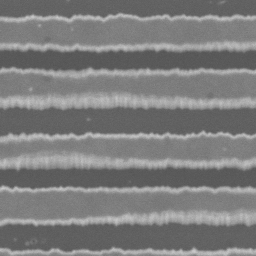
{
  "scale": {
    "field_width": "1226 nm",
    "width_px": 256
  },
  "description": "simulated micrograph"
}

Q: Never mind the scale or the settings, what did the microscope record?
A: lines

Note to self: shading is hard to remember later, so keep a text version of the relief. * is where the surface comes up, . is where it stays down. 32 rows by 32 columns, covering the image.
................................
................................
********************************
********************************
********************************
********************************
................................
................................
.*..............................
********************************
********************************
********************************
********************************
................................
................................
................................
................................
********************************
********************************
********************************
********************************
................................
................................
**....****..***.**********.*****
********************************
********************************
********************************
********************************
................................
................................
................................
********************************